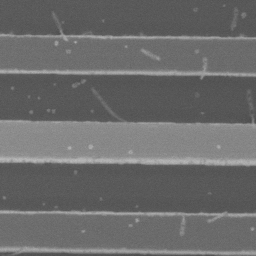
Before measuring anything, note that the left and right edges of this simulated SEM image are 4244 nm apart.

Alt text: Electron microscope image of lines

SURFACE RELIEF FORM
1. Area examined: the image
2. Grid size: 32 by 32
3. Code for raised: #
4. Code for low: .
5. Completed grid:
................................
................................
................................
................................
#############...................
################################
################################
################################
################################
.........................#......
................................
................................
................................
................................
................................
################################
################################
################################
################################
################################
..............................##
................................
................................
................................
................................
................................
##########..##..................
################################
################################
################################
################################
............####################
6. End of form